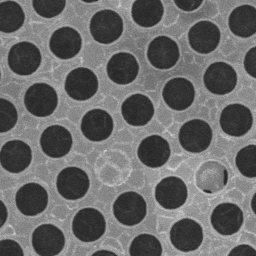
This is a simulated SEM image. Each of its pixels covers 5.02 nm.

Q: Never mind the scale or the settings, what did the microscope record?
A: a regular array of holes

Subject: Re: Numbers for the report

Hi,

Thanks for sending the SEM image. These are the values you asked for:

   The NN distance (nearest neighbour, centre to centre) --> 220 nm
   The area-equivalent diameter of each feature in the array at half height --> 0.174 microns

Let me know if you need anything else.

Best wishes